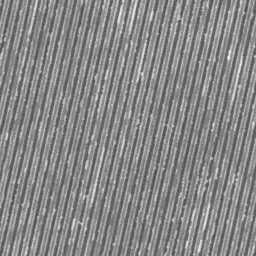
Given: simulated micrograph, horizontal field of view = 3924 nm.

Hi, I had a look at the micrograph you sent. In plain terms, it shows parallel lines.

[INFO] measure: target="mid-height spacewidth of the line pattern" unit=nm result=57.9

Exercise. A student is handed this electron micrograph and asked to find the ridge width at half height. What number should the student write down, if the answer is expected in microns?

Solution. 0.073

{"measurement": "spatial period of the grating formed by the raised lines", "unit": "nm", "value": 136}